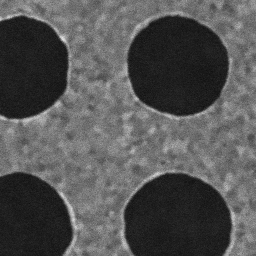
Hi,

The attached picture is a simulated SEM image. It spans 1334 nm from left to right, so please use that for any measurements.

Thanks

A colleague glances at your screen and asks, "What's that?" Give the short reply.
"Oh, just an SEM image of holes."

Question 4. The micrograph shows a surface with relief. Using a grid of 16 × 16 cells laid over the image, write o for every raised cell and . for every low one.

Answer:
oooooooooooooooo
...oooooo....ooo
....oooo......oo
....oooo......oo
....oooo......oo
....oooo......oo
...oooooo....ooo
oooooooooooooooo
oooooooooooooooo
oooooooooooooooo
oooooooooooooooo
...oooooo....ooo
....oooo......oo
....oooo......oo
.....ooo.......o
....oooo......oo